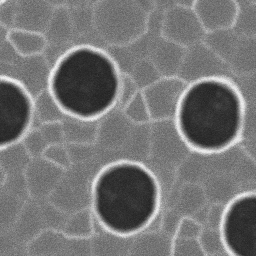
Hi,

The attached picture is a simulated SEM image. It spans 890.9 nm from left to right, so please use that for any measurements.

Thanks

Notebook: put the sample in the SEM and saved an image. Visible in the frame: holes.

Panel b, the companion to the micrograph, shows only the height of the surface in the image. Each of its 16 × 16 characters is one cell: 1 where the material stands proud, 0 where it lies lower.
1111111111111111
1111111111111111
1111111111111111
1111001111111111
1111000111111111
0110000111110011
0011000111100001
0011111111100001
0111111111110001
1111111111111111
1111111001111111
1111110000111111
1111110000111110
1111110001111100
1111111111111100
1111111111111100